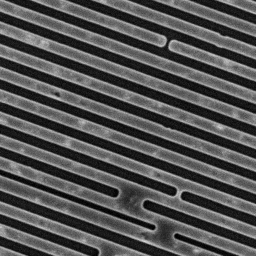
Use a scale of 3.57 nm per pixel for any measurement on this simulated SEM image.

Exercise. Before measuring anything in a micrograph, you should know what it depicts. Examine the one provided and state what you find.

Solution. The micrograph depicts parallel lines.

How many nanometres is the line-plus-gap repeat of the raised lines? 75.2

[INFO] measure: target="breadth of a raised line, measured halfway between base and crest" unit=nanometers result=40.7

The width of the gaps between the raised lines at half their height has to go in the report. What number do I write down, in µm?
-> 0.0339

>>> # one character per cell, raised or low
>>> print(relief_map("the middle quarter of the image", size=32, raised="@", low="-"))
-------@@@@@@@@-------@@@@@@@@--
@@-------@@@@@@@@@-------@@@@@@@
@@@@--------@@@@@@@@-------@@@@@
@@@@@@@--------@@@@@@@@-------@@
--@@@@@@@@--------@@@@@@@@------
-----@@@@@@@@-------@@@@@@@@@---
--------@@@@@@@--------@@@@@@@@-
@@@--------@@@@@@@--------@@@@@@
@@@@@@-------@@@@@@@@--------@@@
@@@@@@@@--------@@@@@@@@-------@
---@@@@@@@@--------@@@@@@@------
-----@@@@@@@@@--------@@@@@@@---
@-------@@@@@@@@@-------@@@@@@@@
@@@@-------@@@@@@@@--------@@@@@
@@@@@@@-------@@@@@@@@--------@@
-@@@@@@@@--------@@@@@@@@-------
----@@@@@@@@-------@@@@@@@@-----
-------@@@@@@@@-------@@@@@@@@--
@@-------@@@@@@@@@-------@@@@@@@
@@@@--------@@@@@@@@@-------@@@@
@@@@@@@--------@@@@@@@@-------@@
--@@@@@@@@--------@@@@@@@@------
-----@@@@@@@@-------@@@@@@@@@---
--------@@@@@@@@-------@@@@@@@@@
@@@--------@@@@@@@--------@@@@@@
@@@@@@-------@@@@@@@@--------@@@
@@@@@@@@--------@@@@@@@@--------
---@@@@@@@@--------@@@@-@@@-----
------@@@@@@@@--------@@@@@@@---
@--------@@@@@@@@-------@@@@@@@@
@@@@-------@@@@@@@@--------@@@@@
@@@@@@@-------@@@@@@@@------@@@@